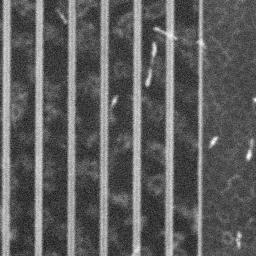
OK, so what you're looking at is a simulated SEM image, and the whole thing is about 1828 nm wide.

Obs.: parallel lines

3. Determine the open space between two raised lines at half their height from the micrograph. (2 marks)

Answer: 202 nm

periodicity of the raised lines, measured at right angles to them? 0.233 um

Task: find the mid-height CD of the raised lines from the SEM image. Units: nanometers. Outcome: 33